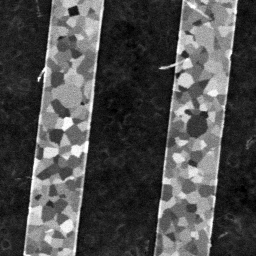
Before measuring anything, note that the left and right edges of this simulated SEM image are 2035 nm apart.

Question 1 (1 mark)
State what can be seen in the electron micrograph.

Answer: one or a few lines or trenches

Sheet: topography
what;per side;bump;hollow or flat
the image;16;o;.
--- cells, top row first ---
...ooo.....oooo.
...ooo.....oooo.
...ooo.....oooo.
...ooo.....ooo..
...ooo.....ooo..
...ooo.....ooo..
...ooo.....ooo..
..oooo.....ooo..
..oooo....oooo..
..ooo.....oooo..
..ooo.....oooo..
..ooo.....oooo..
..ooo.....ooo...
..ooo.....ooo...
..ooo.....ooo...
..ooo.....ooo...